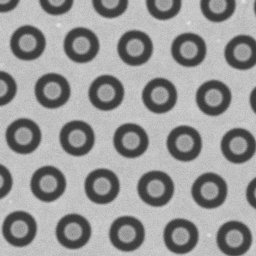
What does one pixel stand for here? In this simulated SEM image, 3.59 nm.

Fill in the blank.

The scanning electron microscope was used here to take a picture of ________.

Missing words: an array of small figures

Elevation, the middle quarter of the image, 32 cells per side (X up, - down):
XXXXXXXXXXXXXXXXX-XXXXXXXXXXXX--
XXXXXXXXXXXXXXXXXXXXXXXXXXXXXXXX
XXXXXXXXXX-XXXXXXXXXXXXXXXXXXXXX
XXXXXXXX-----XXXXXXXXXX--XXXXXXX
-XXXXXX-------XXXXXXX------XXXXX
-XXXXXX--XX----XXXXX--------XXXX
--XXXX---XXX---XXXXX--XXXX--XXXX
--XXXX---XXXX--XXXX---XXXX--XXXX
-XXXXX---XXX---XXXXX--XXXX--XXXX
-XXXXXX--------XXXXX---XX---XXXX
XXXXXXX-------XXXXXX--------XXXX
XXXXXXXXX---XXXXXXXXX------XXXXX
XXXXXXXXXXXXXXXXXXXXXXX-XXXXXXXX
XXXXXXXXXXXXXXXXXXXXXXXXXXXXXXXX
X-----XXXXXXXXXXXXXXXXXXXXXXXXXX
-------XXXXXXX-----XXXXXXXXX---X
-------XXXXXX-------XXXXXXX-----
--XXX---XXXXX--XXX---XXXXX------
-XXXX---XXXX---XXXX--XXXXX--XXXX
-XXXX---XXXX---XXXX--XXXX---XXXX
---X---XXXXX---XXX---XXXXX--XXXX
-------XXXXXX--------XXXXX---XX-
X-----XXXXXXXX------XXXXXXX-----
XXXXXXXXXXXXXXXX--XXXXXXXXXX----
XXXXXXXXXXXXXXXXXXXXXXXXXXXXXXXX
XXXXXXXXXXXXXXXXXXXXXXXXXXXXXXXX
XXXXXXX-----XXXXXXXXXX-XXXXXXXXX
XXXXXX-------XXXXXXX------XXXXXX
XXXXXX---X----XXXXX--------XXXXX
-XXXX---XXX---XXXXX---XX---XXXXX
-XXXX---XXXX--XXXX---XXXX---XXXX
XXXXX---XXX---XXXX---XXXX---XXXX